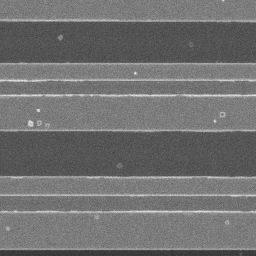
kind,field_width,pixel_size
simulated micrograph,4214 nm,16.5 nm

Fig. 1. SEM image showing lines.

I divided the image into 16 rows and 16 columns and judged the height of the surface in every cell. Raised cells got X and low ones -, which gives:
XXXXXXXXXXXXXXXX
----------------
----------------
----------------
XXXXXXXXXXXXXXXX
XXXXXXXXXXXXXXXX
XXXXXXXXXXXXXXXX
XXXXXXXXXXXXXXXX
----------------
----------------
----------------
XXXXXXXXXXXXXXXX
XXXXXXXXXXXXXXXX
XXXXXXXXXXXXXXXX
XXXXXXXXXXXXXXXX
XXXXXXXXXXXXXXXX